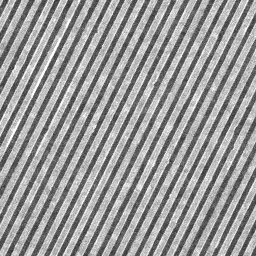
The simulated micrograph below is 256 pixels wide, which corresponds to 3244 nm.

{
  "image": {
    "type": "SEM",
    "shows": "parallel lines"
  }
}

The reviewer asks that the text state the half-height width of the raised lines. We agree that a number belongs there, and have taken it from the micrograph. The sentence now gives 0.0738 microns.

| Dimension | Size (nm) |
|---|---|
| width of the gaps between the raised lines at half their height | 73.8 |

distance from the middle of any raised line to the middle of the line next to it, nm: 146